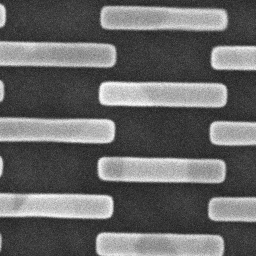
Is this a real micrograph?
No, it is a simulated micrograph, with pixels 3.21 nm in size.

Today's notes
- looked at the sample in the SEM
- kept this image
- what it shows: groups of lines, slits or small figures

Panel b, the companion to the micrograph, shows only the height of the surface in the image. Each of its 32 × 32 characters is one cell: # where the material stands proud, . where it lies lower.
................................
#............###############....
#............###############....
..............#####.............
................................
#############...................
##############.............#####
##############.............#####
...........................#####
................................
.............###..#####.........
.............###############....
.............###############....
................................
................................
##############.............#####
##############............######
###....#######............######
................................
................................
............################....
............################....
...............#############....
................................
############....................
##############............######
##############............######
...........................#####
................................
............###############.....
............################....
............################....